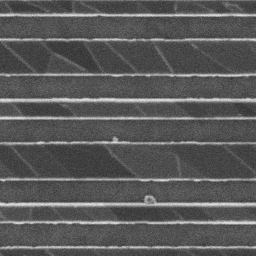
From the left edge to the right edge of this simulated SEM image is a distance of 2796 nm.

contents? lines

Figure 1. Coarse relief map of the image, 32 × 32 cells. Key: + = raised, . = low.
++++++++++++++++++++++++++++++++
++++++++++++++++++++++++++++++++
................................
................................
................................
++++++++++++++++++++++++++++++++
++++++++++++++++++++++++++++++++
++++++++++++++++++++++++++++++++
++++++++++++++++++++++++++++++++
................................
................................
................................
.......................+........
++++++++++++++++++++++++++++++++
++++++++++++++++++++++++++++++++
................................
................................
................................
++++++++++++++++++++++++++++++++
++++++++++++++++++++++++++++++++
++++++++++++++++++++++++++++++++
++++++++++++++++++++++++++++++++
....................+...........
................................
................................
................................
++++++++++++++++++++++++++++++++
++++++++++++++++++++++++++++++++
................................
................................
................................
++++++++++++++++++++++++++++++++